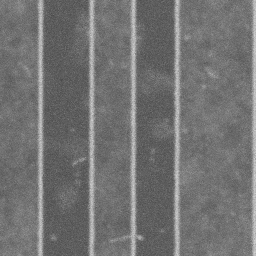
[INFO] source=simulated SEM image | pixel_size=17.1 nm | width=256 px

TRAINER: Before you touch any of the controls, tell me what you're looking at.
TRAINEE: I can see one or a few lines or trenches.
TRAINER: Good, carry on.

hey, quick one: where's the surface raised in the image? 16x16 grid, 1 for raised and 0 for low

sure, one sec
0001110011100000
0001110011100000
0001110011100000
0001110011100000
0001110011100000
0001110011100000
0001110011100000
0001110011100000
0001110011100000
0001110011100000
0001110011100000
0001110011100000
0001110011100000
0001110011100000
0001110011100000
0001110011100000